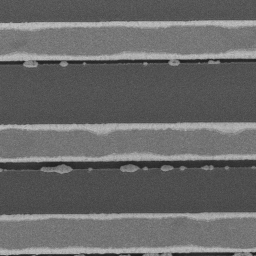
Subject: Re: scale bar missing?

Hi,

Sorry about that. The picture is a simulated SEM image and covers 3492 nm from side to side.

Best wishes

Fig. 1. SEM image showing lines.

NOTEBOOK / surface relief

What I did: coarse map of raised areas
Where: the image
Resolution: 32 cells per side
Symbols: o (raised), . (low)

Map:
................................
................................
................................
oooooooooooooooooooooooooooooooo
oooooooooooooooooooooooooooooooo
oooooooooooooooooooooooooooooooo
oooooooooooooooooooooooooooooooo
................................
................................
................................
................................
................................
................................
................................
................................
................................
oooooooooooooooooooooooooooooooo
oooooooooooooooooooooooooooooooo
oooooooooooooooooooooooooooooooo
oooooooooooooooooooooooooooooooo
................................
................................
................................
................................
................................
................................
................................
oooooooooooooooooooooooooooooooo
oooooooooooooooooooooooooooooooo
oooooooooooooooooooooooooooooooo
oooooooooooooooooooooooooooooooo
oooooooooooooooo................